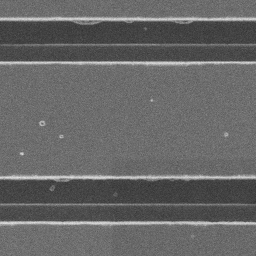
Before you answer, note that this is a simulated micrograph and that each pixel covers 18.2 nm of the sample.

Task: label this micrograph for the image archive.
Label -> lines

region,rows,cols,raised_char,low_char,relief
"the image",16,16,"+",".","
++++++++++++++++
................
................
................
++++++++++++++++
++++++++++++++++
++++++++++++++++
++++++++++++++++
++++++++++++++++
++++++++++++++++
++++++++++++++++
................
................
................
++++++++++++++++
++++++++++++++++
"